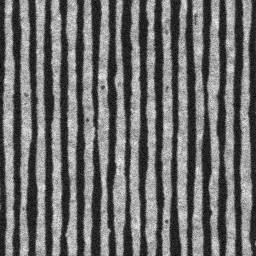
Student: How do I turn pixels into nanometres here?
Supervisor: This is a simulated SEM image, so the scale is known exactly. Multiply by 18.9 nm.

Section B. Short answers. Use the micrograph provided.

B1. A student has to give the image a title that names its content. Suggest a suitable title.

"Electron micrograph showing parallel lines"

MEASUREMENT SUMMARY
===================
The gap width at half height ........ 151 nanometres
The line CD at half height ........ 132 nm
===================